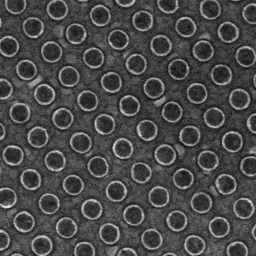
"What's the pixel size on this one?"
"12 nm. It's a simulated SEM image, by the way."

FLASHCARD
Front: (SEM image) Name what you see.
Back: a regular array of raised bodies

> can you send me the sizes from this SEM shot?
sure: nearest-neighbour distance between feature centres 359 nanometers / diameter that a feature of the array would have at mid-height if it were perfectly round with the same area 235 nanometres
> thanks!